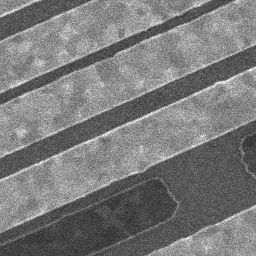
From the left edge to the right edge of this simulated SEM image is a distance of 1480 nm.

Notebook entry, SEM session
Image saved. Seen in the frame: one or a few lines or trenches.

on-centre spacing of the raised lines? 64.6 px